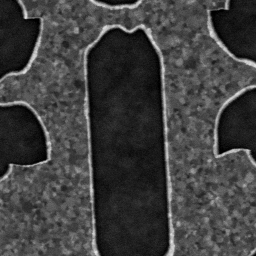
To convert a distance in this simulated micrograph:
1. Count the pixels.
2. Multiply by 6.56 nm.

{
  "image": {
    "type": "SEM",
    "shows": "one or a few lines or trenches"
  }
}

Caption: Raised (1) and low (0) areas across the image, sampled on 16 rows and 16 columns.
0111111111111100
0001111111111000
0011110001111100
0011100000111110
0111100000111111
1111100000111111
0111100000111100
0001100000111100
0001110000111000
0001110000111110
0111110000011111
1111110000011111
1111110000011111
1111110000011111
1111110000011111
1111110000011111